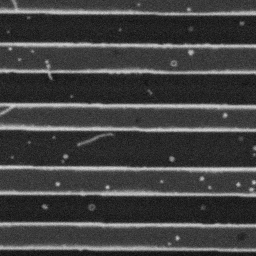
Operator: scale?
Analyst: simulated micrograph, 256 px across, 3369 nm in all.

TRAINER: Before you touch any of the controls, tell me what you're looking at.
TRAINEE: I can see lines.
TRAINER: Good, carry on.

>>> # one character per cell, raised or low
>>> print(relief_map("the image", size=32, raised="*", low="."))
********************************
********************************
................................
................................
................................
***.............................
********************************
********************************
********************************
................................
................................
................................
................................
********************************
********************************
********************************
................................
................................
................................
................................
................................
********************************
********************************
********************************
..............................**
................................
................................
................................
********************************
********************************
********************************
................................